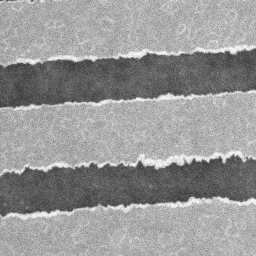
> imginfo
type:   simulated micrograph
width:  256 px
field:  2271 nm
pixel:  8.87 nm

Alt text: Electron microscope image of one or a few lines or trenches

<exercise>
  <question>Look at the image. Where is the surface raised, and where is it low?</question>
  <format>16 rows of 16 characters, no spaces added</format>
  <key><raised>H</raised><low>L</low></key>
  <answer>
HHHHHHHHHHHHHHHH
HHHHHHHHHHHHHHHH
HHHHHHHHHHHHHHHH
HHHHHHHHHLLLLLLL
LLLLLLLLLLLLLLLL
LLLLLLLLLLLLLLLL
LLLLHHHHHHHHHHHH
HHHHHHHHHHHHHHHH
HHHHHHHHHHHHHHHH
HHHHHHHHHHHHHHHH
HHHLLLLLLLLLLLLL
LLLLLLLLLLLLLLLL
LLLLLLLLLLLLHHLL
HHHHHHHHHHHHHHHH
HHHHHHHHHHHHHHHH
HHHHHHHHHHHHHHHH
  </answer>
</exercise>